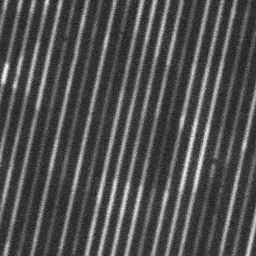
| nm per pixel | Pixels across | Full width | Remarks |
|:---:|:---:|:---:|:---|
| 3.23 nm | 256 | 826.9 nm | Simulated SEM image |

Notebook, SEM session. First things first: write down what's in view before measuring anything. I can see parallel lines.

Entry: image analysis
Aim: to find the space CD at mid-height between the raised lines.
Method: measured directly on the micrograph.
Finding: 0.0347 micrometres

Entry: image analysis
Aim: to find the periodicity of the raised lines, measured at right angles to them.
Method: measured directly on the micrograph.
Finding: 42.5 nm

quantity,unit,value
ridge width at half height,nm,7.5